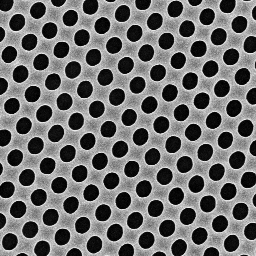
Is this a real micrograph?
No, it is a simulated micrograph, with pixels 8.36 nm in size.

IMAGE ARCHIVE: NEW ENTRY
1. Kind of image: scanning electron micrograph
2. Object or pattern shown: a regular array of holes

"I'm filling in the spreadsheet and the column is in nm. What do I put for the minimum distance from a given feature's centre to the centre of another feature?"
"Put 192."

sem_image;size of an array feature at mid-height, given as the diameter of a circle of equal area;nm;138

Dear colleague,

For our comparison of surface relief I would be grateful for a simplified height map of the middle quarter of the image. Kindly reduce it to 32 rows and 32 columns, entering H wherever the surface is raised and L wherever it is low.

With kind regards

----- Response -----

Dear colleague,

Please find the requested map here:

HLLLHHHHHHHHHLLLLHHHHHHLLHHLLLHH
LLLLHHHHHLLHHHLLLHHHHHLLLHHHHHHH
LLLLHHHHHLLLHHHHHHHHHLLLLLHHHHHL
HLLHHHHHLLLLHHHHHLLLHHLLLHHHHHLL
HHHHLLHHHLLLHHHHHLLLHHHHHHHHHHLL
HHHHLLLHHHHHHHHHLLLLHHHHHLLLHHLL
HHHLLLLHHHHHLLLHHLLLHHHHHLLLHHHH
LHHLLLLHHHHLLLLHHHHHHHHHLLLLHHHH
LLHHLLHHHHHLLLLHHHHHLLLHHLLLHHHH
LLHHHHHLLHHLLLLHHHHHLLLHHHHHHHHH
LLHHHHLLLLHHHHHHHHHLLLLHHHHHLLLH
LHHHHHLLLLHHHHHHLHHLLLLHHHHHLLLH
HHLLHHLLLLHHHHHLLLHHHHHHHHHLLLLH
HLLLLHHHHHHHHHLLLLHHHHHLLLHHLLLH
HLLLLHHHHHLLHHHLLLHHHHLLLLHHHHHH
HLLLLHHHHLLLLHHHHHHHHHLLLLHHHHHL
HHHHHHHHHLLLLHHHHHLLLHHLLLHHHHLL
HHHHHLLHHLLLLHHHHLLLLHHHHHHHHHLL
HHHHLLLLHHHHHHHHHLLLLHHHHHLLLHHL
HHHHLLLLHHHHHLLHHLLLLHHHHLLLLHHH
LLHHLLLLHHHHLLLLHHHHHHHHHLLLLHHH
LLLHHHHHHHHHLLLLHHHHHLLHHHLLLHHH
LLLHHHHHLLHHLLLLHHHHLLLLHHHHHHHH
LLLHHHHLLLLHHHHHHHHHLLLLHHHHHLLL
LHHHHHHLLLLHHHHHLLHHLLLLHHHHLLLL
HHHLLHHLLLLHHHHLLLLHHHHHHHHHLLLL
HHLLLLHHHHHHHHHLLLLHHHHHLLLHHLLL
HHLLLLHHHHHLLHHLLLHHHHHLLLLHHHHH
HHLLLLHHHHLLLLHHHHHHHHHLLLLHHHHH
LHHLHHHHHHLLLLHHHHHLLHHHLLHHHHHL
LHHHHHLLHHLLLHHHHHLLLLHHHHHHHHHL
HHHHHLLLLHHHHHHHHHLLLLHHHHHLLLHH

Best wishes